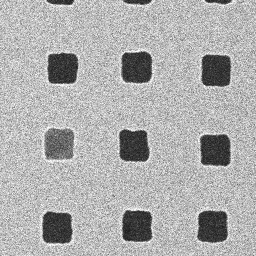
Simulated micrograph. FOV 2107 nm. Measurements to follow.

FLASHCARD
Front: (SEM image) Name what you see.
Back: a regular array of holes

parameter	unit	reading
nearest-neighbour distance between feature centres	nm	620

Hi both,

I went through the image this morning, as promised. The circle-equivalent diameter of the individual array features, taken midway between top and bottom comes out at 275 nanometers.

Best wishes